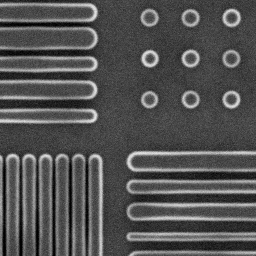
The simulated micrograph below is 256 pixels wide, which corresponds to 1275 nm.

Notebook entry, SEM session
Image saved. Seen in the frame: groups of lines, slits or small figures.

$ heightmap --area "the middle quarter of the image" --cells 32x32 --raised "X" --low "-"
XXXXXXXX-------------X---------X
XXXX----------------------------
--------------------------------
--------------------------------
XXXXXXX-------------------------
XXXXXXXX------------------------
XXXXXXXX------------------------
XXXXXXXX------------XXX-------XX
XXXXXXX-------------XXX-------XX
--------------------XXX-------XX
--------------------XX---------X
XXXX----------------------------
XXXXXXXX------------------------
XXXXXXXX------------------------
--------------------------------
--------------------------------
--------------------------------
--------------------------------
--------------------------------
--------------------------------
--------------------------------
--------------------------------
-----------------XXXXXXXXXXXXXXX
X-XXX--XX-------XXXXXXXXXXXXXXXX
X-XXX-XXX-------XXXXXXXXXXXXXXXX
X-XXX-XXX-------XXXXXXXXXXXXXXXX
X-XXX-XXX----------------XXX----
X-XXX-XXX-----------------------
X-XXX-XXX-----------------------
X-XXX-XXX-------XXXXXXXXXXXXXXXX
X-XXX-XXX-------XXXXXXXXXXXXXXXX
X-XXX-XXX-------XXXXXXXXXXXXXXXX